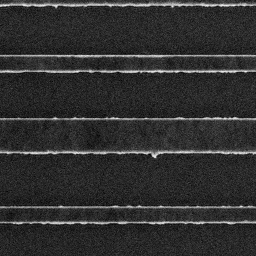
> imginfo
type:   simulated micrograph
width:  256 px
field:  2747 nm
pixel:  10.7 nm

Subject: lines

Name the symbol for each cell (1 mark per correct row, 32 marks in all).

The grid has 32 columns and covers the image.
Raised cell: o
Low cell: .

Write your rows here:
oooooooooooooooooooooooooooooooo
................................
................................
................................
................................
................................
................................
oooooooooooooooooooooooooooooooo
oooooooooooooooooooooooooooooooo
................................
................................
................................
................................
................................
................................
oooooooooooooooooooooooooooooooo
oooooooooooooooooooooooooooooooo
oooooooooooooooooooooooooooooooo
oooooooooooooooooooooooooooooooo
................................
................................
................................
................................
................................
................................
................................
oooooooooooooooooooooooooooooooo
oooooooooooooooooooooooooooooooo
................................
................................
................................
................................